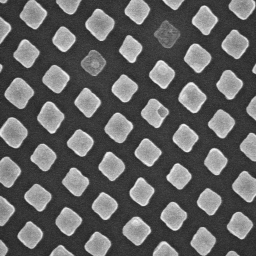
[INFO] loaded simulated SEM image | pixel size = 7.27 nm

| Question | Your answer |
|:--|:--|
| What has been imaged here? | a regular array of raised bodies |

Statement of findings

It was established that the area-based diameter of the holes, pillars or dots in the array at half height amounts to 0.174 microns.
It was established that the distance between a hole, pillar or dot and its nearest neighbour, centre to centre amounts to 281 nm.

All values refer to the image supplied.